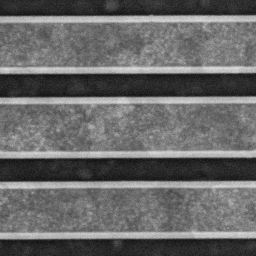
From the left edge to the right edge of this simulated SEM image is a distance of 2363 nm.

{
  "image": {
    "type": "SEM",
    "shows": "one or a few lines or trenches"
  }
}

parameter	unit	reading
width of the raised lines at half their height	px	50.6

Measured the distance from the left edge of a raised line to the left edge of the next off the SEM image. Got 763 nm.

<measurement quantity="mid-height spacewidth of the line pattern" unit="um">0.277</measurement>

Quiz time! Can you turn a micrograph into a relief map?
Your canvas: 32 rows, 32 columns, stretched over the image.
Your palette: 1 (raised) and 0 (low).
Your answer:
00000000000000000000000000000000
00000000000000000000000000000000
00000000000001111111111111111111
11111111111111111111111111111111
11111111111111111111111111111111
11111111111111111111111111111111
11111111111111111111111111111111
11111111111111111111111111111111
11111111111111111111111111111111
00000000000000000000000000000000
00000000000000000000000000000000
00000000000000000000000000000000
00000000000000000000000000000000
11111111111111111111111111111111
11111111111111111111111111111111
11111111111111111111111111111111
11111111111111111111111111111111
11111111111111111111111111111111
11111111111111111111111111111111
00000000000000000000000000000000
00000000000000000000000000000000
00000000000000000000000000000000
00000000000000000000000000000000
11111111111111111111111111111111
11111111111111111111111111111111
11111111111111111111111111111111
11111111111111111111111111111111
11111111111111111111111111111111
11111111111111111111111111111111
00000000000000000000000000000000
00000000000000000000000000000000
00000000000000000000000000000000